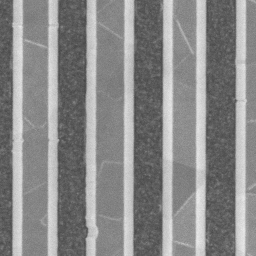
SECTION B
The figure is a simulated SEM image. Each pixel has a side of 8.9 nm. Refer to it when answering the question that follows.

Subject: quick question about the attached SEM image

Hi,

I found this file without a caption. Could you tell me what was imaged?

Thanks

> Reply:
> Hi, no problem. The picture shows one or a few lines or trenches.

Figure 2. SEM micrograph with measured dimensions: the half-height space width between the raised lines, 39 pixels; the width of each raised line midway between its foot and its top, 309 nanometers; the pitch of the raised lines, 663 nm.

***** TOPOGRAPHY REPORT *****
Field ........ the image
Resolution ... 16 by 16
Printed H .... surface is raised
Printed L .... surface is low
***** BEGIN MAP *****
LHHLLLHHLLLHHLLH
LHHLLLHHLLLHHLLH
LHHLLLHHLLLHHLLH
LHHLLLHHLLLHHLLH
LHHLLLHHLLLHHLLH
LHHLLLHHLLLHHLLH
LHHLLLHHLLLHHLLH
LHHLLLHHLLLHHLLH
LHHLLLHHLLLHHLLH
LHHLLLHHLLLHHLLH
LHHLLLHHLLLHHLLH
LHHLLLHHLLLHHLLH
LHHLLLHHLLLHHLLH
LHHLLLHHLLLHHLLH
LHHLLLHHLLHHHLLH
LHHLLLHHLLHHLLLH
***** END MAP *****